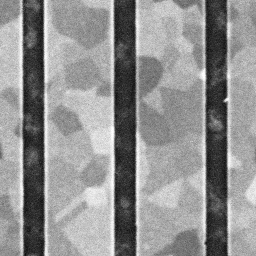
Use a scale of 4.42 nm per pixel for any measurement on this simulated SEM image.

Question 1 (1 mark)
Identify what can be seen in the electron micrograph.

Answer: one or a few lines or trenches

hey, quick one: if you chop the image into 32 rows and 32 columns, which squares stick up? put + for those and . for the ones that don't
+++...++++++++...+++++++++...+++
+++...++++++++...+++++++++...+++
+++...++++++++...+++++++++...+++
+++...++++++++...+++++++++...+++
+++...++++++++...+++++++++...+++
+++...++++++++...+++++++++...+++
+++...++++++++...+++++++++...+++
+++...++++++++...+++++++++...+++
+++...++++++++...+++++++++...+++
+++...++++++++...+++++++++...+++
+++...++++++++...+++++++++..++++
+++...++++++++...+++++++++...+++
+++...++++++++...+++++++++..++++
+++...++++++++...+++++++++...+++
+++...++++++++...+++++++++...+++
+++...++++++++...+++++++++...+++
+++...++++++++...+++++++++...+++
+++...++++++++...+++++++++...+++
+++...++++++++...+++++++++...+++
+++...++++++++...+++++++++...+++
+++...++++++++...+++++++++...+++
+++...++++++++...+++++++++...+++
+++...++++++++...+++++++++..++++
+++...++++++++...+++++++++...+++
+++...++++++++...+++++++++...+++
+++...++++++++...+++++++++...+++
+++...++++++++...+++++++++...+++
+++...++++++++...+++++++++...+++
+++...++++++++...+++++++++...+++
+++...++++++++...+++++++++...+++
+++...++++++++...+++++++++...+++
+++...++++++++...+++++++++...+++